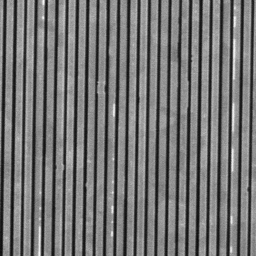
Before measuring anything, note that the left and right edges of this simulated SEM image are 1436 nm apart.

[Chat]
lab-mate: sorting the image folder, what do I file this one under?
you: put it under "parallel lines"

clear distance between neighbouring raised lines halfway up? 3.87 px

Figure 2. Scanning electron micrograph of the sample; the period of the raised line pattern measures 0.0578 microns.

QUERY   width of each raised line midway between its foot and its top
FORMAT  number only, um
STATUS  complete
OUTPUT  0.0371